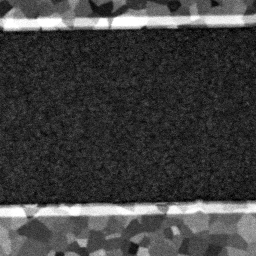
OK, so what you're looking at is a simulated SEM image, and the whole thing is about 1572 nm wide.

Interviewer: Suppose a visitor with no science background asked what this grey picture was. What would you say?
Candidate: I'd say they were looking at one or a few lines or trenches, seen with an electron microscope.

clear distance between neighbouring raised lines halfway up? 1160 nanometres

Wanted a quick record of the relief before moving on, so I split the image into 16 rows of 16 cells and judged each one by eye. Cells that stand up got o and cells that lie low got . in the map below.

oooooooooooooooo
................
................
................
................
................
................
................
................
................
................
................
................
oooooooooooooooo
oooooooooooooooo
oooooooooooooooo